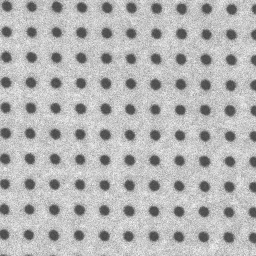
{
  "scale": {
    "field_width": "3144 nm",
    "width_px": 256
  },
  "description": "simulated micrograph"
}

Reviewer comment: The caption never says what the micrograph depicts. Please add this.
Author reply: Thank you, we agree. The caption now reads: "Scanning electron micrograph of a regular array of holes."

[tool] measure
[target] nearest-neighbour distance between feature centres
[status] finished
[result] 24.7 pixels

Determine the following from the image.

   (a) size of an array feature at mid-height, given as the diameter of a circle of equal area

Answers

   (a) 134 nanometres